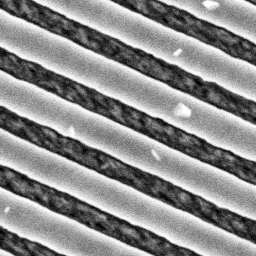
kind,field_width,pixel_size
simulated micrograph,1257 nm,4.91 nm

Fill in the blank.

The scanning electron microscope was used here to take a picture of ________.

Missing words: lines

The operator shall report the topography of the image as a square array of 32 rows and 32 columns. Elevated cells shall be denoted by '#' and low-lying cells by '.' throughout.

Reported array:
.....##########......##########.
#......##########.......########
###......##########.......######
#####......##########.......####
#######.......#########.......##
##########......##########......
.###########......##########....
...###########......##########..
......##########.......#########
#.......##########.......#######
####......###########......#####
######......###########......###
########.......##########......#
.#########.......##########.....
...##########......##########...
.....##########......###########
#......##########......#########
###.......#########.......######
#####.......#########.......####
########......##########......##
##########......##########......
..##########......##########....
....##########.......#########..
.......##########......#########
##.......##########......#######
#####......##########......#####
#######......##########......###
#########.......#########.......
.##########.......#########.....
...##########.......##########..
.....###########......##########
#......###########......########